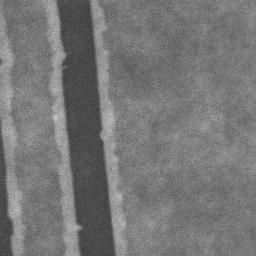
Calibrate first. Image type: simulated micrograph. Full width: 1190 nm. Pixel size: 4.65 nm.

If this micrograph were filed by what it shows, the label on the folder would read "one or a few lines or trenches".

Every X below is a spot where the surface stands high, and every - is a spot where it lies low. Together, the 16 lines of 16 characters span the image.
XXX---XXXXXXXXXX
XXX---XXXXXXXXXX
XXXX--XXXXXXXXXX
XXXX--XXXXXXXXXX
XXXX--XXXXXXXXXX
XXXX--XXXXXXXXXX
XXXX---XXXXXXXXX
XXXX---XXXXXXXXX
XXXX---XXXXXXXXX
-XXX---XXXXXXXXX
-XXX---XXXXXXXXX
-XXX---XXXXXXXXX
-XXX---XXXXXXXXX
-XXX---XXXXXXXXX
-XXXX--XXXXXXXXX
-XXXX--XXXXXXXXX